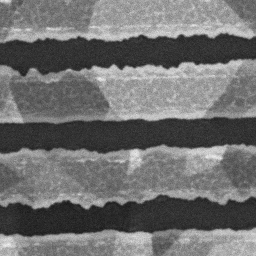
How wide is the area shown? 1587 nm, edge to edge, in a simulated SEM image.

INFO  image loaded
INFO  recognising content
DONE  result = one or a few lines or trenches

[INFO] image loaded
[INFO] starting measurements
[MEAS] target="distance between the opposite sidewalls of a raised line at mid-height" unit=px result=47.5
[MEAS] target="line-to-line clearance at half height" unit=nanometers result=218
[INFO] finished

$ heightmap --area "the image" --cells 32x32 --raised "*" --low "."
********************************
********************************
********************************
********************************
*****..**...***.................
................................
................................
................................
..................*...***.******
*****..*************************
********************************
********************************
********************************
********************************
*********************.**........
................................
................................
................................
...................*.........*..
.*******************************
********************************
********************************
********************************
********************************
*******************......******.
....**....**....................
................................
................................
................................
..........********.*************
********************************
********************************